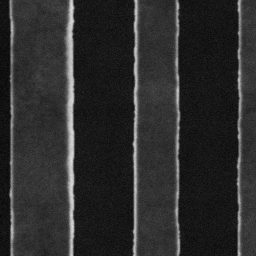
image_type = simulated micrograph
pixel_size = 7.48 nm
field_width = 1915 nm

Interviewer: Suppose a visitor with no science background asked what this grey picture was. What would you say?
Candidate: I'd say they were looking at lines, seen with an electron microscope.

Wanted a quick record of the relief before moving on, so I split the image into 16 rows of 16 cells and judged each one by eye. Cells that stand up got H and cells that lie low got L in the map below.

LHHHHLLLHHHLLLLH
LHHHHLLLHHHLLLLH
LHHHLLLLHHHLLLLH
LHHHLLLLHHHLLLLH
LHHHHLLLHHHLLLLH
LHHHHLLLHHHLLLLH
LHHHHLLLHHHLLLLH
LHHHLLLLHHHLLLLH
LHHHHLLLHHHLLLLH
LHHHHLLLHHHLLLLH
LHHHHLLLHHHLLLLH
LHHHHLLLHHHLLLLH
LHHHHLLLHHHLLLLH
LHHHHLLLHHHLLLLH
LHHHHLLLHHHLLLLH
LHHHHLLLHHHLLLLH